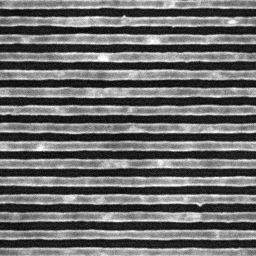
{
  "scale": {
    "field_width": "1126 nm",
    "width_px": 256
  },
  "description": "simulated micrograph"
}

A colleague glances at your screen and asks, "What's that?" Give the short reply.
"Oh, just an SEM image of parallel lines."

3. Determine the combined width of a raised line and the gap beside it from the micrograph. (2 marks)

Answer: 0.0782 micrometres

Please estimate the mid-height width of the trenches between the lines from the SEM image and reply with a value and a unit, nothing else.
41.8 nanometers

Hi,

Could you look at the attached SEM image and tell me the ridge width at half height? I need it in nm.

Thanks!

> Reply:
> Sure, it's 38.